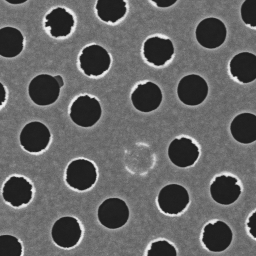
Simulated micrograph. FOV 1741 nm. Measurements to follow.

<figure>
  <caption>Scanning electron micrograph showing a regular array of holes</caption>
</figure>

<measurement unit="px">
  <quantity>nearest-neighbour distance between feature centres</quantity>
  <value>47.9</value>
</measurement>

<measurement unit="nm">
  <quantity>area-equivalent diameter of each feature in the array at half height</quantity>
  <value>204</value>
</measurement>